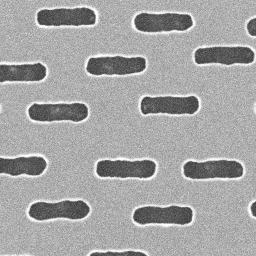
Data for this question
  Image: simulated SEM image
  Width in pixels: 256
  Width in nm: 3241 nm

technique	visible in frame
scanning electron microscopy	a regular array of holes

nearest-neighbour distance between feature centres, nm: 857